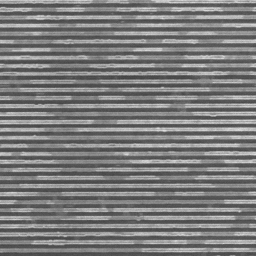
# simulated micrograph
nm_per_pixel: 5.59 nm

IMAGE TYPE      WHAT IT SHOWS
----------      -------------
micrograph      parallel lines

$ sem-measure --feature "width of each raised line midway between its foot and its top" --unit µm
0.0203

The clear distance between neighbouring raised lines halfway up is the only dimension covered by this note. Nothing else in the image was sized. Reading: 25.2 nm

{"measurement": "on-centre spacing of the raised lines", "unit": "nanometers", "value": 44.9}